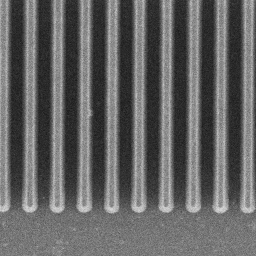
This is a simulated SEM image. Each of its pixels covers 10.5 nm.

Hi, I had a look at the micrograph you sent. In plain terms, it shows parallel lines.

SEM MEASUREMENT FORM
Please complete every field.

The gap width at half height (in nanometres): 165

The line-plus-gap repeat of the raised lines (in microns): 0.285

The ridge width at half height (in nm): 126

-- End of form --